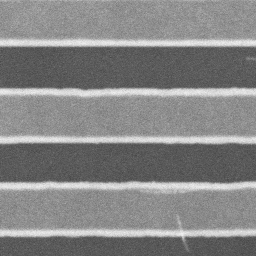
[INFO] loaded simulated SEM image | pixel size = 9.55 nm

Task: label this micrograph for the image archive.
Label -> lines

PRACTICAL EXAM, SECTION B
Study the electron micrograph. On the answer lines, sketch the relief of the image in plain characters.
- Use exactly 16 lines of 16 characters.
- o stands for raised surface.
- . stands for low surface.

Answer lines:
oooooooooooooooo
oooooooooooooooo
oooooooooooooooo
................
................
................
oooooooooooooooo
oooooooooooooooo
oooooooooooooooo
................
................
..oooo.ooooo...o
oooooooooooooooo
oooooooooooooooo
oooooooooooooooo
................